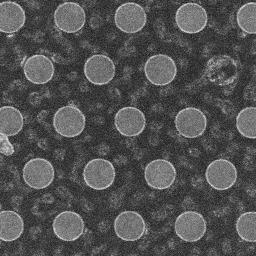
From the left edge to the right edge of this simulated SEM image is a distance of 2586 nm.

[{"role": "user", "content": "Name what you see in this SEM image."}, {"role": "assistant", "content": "a regular array of raised bodies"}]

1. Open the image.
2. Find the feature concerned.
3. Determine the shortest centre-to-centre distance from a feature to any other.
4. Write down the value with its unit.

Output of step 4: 0.608 microns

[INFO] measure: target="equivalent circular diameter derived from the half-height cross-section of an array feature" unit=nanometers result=303